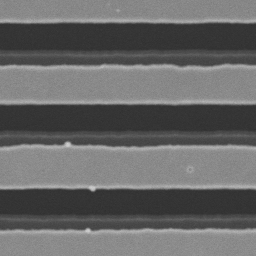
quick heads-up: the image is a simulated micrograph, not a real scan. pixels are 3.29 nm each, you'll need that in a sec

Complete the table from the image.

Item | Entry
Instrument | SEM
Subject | lines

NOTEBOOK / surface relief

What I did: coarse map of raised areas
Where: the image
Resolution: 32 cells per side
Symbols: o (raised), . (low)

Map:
oooooooooooooooooooooooooooooooo
oooooooooooooooooooooooooooooooo
oooooooooooooooooooooooooooooooo
................................
................................
................................
................................
oooooooooooooooooooooooooooooooo
oooooooooooooooooooooooooooooooo
oooooooooooooooooooooooooooooooo
oooooooooooooooooooooooooooooooo
oooooooooooooooooooooooooooooooo
oooooooooooooooooooooooooooooooo
................................
................................
................................
................................
oooooooooooooooooooooooooooooooo
oooooooooooooooooooooooooooooooo
oooooooooooooooooooooooooooooooo
oooooooooooooooooooooooooooooooo
oooooooooooooooooooooooooooooooo
oooooooooooooooooooooooooooooooo
oooooooooooooooooooooooooooooooo
................................
................................
................................
oooooooooooooooooooooooooooooooo
oooooooooooooooooooooooooooooooo
oooooooooooooooooooooooooooooooo
oooooooooooooooooooooooooooooooo
oooooooooooooooooooooooooooooooo